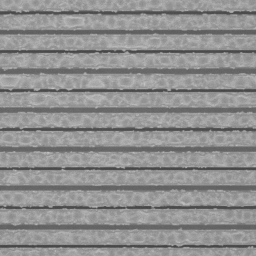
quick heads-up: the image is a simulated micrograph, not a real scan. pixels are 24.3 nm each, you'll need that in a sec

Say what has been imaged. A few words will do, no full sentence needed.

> parallel lines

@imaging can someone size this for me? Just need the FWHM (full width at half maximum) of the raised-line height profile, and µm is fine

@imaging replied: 0.368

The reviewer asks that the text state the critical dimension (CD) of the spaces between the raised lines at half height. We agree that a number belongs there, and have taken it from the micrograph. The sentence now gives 82.1 nanometers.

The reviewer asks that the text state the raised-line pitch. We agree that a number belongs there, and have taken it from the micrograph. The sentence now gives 0.476 micrometres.